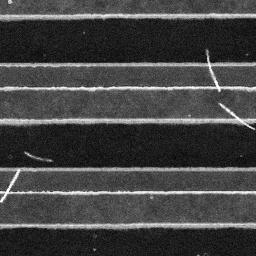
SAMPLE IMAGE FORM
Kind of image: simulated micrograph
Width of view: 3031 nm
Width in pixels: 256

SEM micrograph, lines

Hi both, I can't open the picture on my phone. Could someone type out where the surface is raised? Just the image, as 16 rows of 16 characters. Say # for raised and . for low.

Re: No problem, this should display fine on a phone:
################
................
................
................
################
################
################
####.####......#
................
................
................
################
################
################
................
................